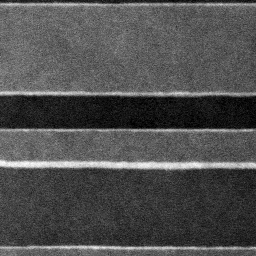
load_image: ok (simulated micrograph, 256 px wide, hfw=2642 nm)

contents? lines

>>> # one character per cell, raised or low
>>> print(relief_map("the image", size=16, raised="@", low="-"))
@@@@@@@@@@@@@@@@
@@@@@@@@@@@@@@@@
@@@@@@@@@@@@@@@@
@@@@@@@@@@@@@@@@
@@@@@@@@@@@@@@@@
@@@@@@@@@@@@@@@@
----------------
----------------
@@@@@@@@@@@@@@@@
@@@@@@@@@@@@@@@@
----------------
----------------
----------------
----------------
----------------
@@@@@@@@@-------